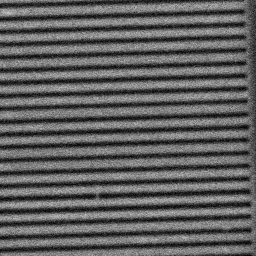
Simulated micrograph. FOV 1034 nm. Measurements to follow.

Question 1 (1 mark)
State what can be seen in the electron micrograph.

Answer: parallel lines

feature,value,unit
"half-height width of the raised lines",0.0308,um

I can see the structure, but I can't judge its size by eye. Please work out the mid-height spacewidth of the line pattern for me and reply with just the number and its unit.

20.7 nm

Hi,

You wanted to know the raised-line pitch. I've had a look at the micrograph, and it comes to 51.8 nm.